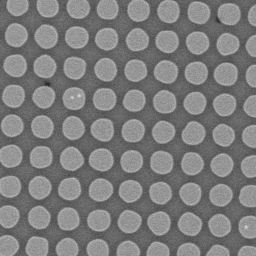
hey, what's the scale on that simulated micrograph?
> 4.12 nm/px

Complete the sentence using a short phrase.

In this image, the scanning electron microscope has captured an array of small figures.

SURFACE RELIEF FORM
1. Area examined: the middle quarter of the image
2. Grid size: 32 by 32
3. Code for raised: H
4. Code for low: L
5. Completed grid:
HHHHHLLLHHHHHLLHHHHHLLLHHHHHLLLH
HHHHHLLLHHHHHLLHHHHHHLLHHHHHLLHH
HHHHHLLLHHHHHLLHHHHHHLLHHHHHLLHH
LLHHLLLLLHHHLLLLHHHHLLLHHHHHLLHH
LLLLLLLLLLLLLLLLLLLLLLLLLHHLLLLH
LLLLLLLLLLLLLLLLLLLLLLLLLLLLLLLL
LHHHLLLLLHHHLLLLLLLLLLLLLLLLLLLL
HHHHHLLLHHHHHLLLHHHHLLLHHHHLLLLH
HHHHHLLHHHHHHLLHHHHHLLHHHHHHLLHH
HHHHHLLHHHHHHLLHHHHHLLHHHHHHLLHH
HHHHHLLLHHHHLLLHHHHHLLLHHHHHLLHH
LLLLLLLLLLHLLLLLHHHLLLLHHHHLLLLH
LLLLLLLLLLLLLLLLLLLLLLLLLLLLLLLL
LHHLLLLLLLLLLLLLLLLLLLLLLLLLLLLL
HHHHLLLLHHHHLLLLHHHLLLLLHHLLLLLL
HHHHHLLHHHHHLLLHHHHHLLLHHHHLLLLH
HHHHHLLHHHHHLLLHHHHHLLHHHHHHLLHH
HHHHHLLHHHHHLLLHHHHHLLHHHHHHLLHH
LHHHLLLLHHHHLLLHHHHLLLLHHHHLLLHH
LLLLLLLLLLLLLLLLLLLLLLLHHHLLLLHH
LLLLLLLLLLLLLLLLLLLLLLLLLLLLLLLL
HHHLLLLLHHHLLLLLLLLLLLLLLLLLLLLL
HHHHLLLHHHHHLLLHHHHLLLHHHHLLLLLH
HHHHHLHHHHHHLLHHHHHLLLHHHHHLLLHH
HHHHHLHHHHHHLLHHHHHLLLHHHHHLLLHH
HHHHLLLHHHHHLLHHHHHLLLHHHHHLLLHH
LLLLLLLLHHHLLLLHHHLLLLHHHHHLLLHH
LLLLLLLLLLLLLLLLLLLLLLLLLLLLLLLH
LLLLLLLLLLLLLLLLLLLLLLLLLLLLLLLL
HHHHLLLHHHHLLLLHHHLLLLLLLLLLLLLL
HHHHLLLHHHHHLLHHHHHLLLHHHHLLLLHH
HHHHLLHHHHHHLLHHHHHLLHHHHHHLLHHH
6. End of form